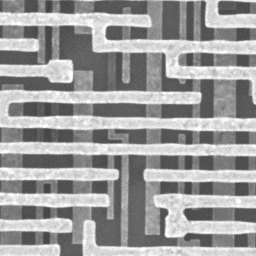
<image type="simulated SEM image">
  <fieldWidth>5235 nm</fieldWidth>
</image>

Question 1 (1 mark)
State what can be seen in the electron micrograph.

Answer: wiring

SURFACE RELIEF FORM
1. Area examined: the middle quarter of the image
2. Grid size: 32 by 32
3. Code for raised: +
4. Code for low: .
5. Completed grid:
++........................+++...
++........................++++++
++........................++++++
++............................++
++..............................
................................
................................
++++++++++++++++++++++++++++++++
++++++++++++++++++++++++++++++++
++++++++++++++..++++++++++++++++
................................
................................
................................
++++++++++++++++++++++++........
++++++++++++++++++++++++++++++++
++++++++++++++++++++++++++++++++
...............................+
................................
................................
................................
++++++++++++++++++++++++++++++++
++++++++++++++++++++++++++++++++
.....++++..++++...++++++++++++++
................................
................................
................................
+++++++++++++.......+++++++.....
++++++++++++++......++++++++++++
+++++++++++++.......++++++++++++
................................
................................
................................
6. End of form